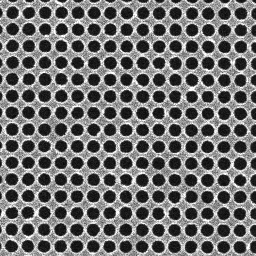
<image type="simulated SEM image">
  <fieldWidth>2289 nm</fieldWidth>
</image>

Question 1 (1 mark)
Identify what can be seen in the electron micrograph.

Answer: a regular array of holes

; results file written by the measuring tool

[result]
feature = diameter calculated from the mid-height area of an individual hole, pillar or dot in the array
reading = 114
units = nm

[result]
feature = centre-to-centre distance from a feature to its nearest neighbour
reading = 144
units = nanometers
